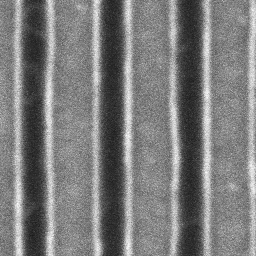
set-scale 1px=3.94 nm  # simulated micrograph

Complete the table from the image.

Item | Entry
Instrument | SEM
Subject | one or a few lines or trenches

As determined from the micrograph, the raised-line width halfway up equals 138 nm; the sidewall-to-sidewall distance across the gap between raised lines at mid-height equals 168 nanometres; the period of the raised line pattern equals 309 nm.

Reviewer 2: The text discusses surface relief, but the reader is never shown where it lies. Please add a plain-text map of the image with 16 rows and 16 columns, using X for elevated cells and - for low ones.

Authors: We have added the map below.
-XX---XX---XX---
-XX---XX---XX---
-XX---XX---XX---
-XX---XX---XX---
-XX---XX---XX---
-XX---XX---XX---
-XX---XX---XX---
-XX---XX---XX---
-XX---XX---XX---
-XX---XX---XX---
-XX---XX---XX---
-XX---XX---XX---
-XX---XX---XX---
-XX---XX---XX---
-XX---XX---XX---
-XX---XX---XX---